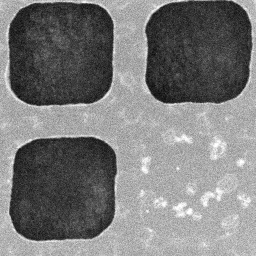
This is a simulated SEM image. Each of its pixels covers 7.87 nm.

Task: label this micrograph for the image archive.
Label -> holes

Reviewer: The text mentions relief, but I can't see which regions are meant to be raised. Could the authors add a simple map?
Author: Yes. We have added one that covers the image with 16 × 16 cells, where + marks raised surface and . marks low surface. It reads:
+.....++++.....+
+......++.......
+......++.......
+......++.......
.......++.......
+......++......+
++....++++++++++
++++++++++++++++
++++++++++++++++
+......+++++++++
+......+++++++++
+......+++++++++
+......+++++++++
+......+++++++++
+.....++++++++++
++++++++++++++++